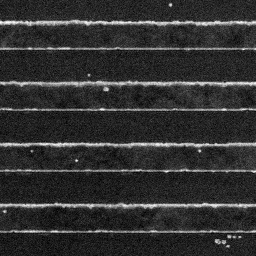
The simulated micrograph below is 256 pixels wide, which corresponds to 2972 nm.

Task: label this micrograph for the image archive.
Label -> lines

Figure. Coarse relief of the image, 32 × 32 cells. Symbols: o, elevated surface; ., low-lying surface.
................................
................................
................................
oooooooooooooooooooooooooooooooo
oooooooooooooooooooooooooooooooo
oooooooooooooooooooooooooooooooo
................................
................................
................................
................................
oooooooooooooooooooooooooooooooo
oooooooooooooooooooooooooooooooo
oooooooooooooooooooooooooooooooo
oooooooooooooooooooooooooooooooo
................................
................................
................................
................................
oooooooooooooooooooooooooooooooo
oooooooooooooooooooooooooooooooo
oooooooooooooooooooooooooooooooo
................................
................................
................................
................................
................................
oooooooooooooooooooooooooooooooo
oooooooooooooooooooooooooooooooo
oooooooooooooooooooooooooooooooo
................................
................................
................................